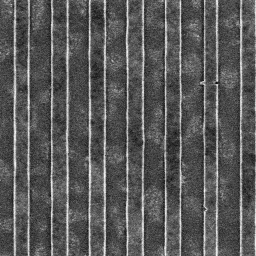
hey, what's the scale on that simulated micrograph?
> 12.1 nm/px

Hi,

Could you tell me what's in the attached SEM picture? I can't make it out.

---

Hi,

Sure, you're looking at parallel lines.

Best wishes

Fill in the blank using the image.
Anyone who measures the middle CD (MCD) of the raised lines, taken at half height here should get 184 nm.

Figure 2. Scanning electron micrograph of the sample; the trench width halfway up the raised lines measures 0.276 microns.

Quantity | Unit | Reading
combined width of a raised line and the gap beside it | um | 0.456